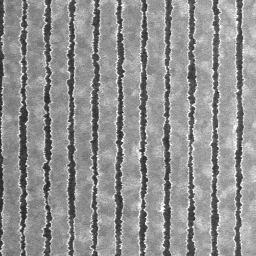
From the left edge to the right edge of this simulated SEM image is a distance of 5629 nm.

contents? parallel lines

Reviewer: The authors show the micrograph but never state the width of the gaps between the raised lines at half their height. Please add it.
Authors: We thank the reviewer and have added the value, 135 nm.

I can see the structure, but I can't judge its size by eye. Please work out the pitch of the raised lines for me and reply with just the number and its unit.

526 nanometres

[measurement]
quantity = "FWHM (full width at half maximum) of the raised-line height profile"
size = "17.4 pixels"